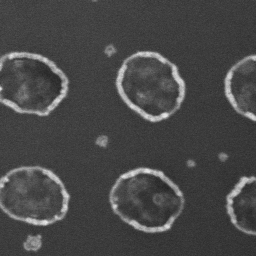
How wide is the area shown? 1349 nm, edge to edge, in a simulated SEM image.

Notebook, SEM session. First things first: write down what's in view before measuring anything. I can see raised bodies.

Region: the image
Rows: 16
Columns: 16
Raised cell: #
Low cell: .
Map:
................
................
................
.#......##......
####....###...##
####...####...##
####....###....#
................
................
................
................
####...####....#
####...####...##
.###....###...##
................
................